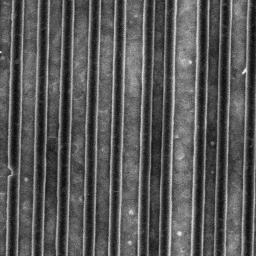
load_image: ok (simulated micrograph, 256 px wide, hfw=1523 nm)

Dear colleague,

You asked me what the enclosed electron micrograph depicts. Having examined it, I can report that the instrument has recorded parallel lines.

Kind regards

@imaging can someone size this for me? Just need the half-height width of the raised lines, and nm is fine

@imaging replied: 69.2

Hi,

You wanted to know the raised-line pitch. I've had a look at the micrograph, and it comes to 26.1 pixels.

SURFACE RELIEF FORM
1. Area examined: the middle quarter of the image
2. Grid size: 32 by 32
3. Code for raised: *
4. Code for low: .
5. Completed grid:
**....***...***.....**...***....
**....***...***.....**...***....
**....**....***.....**...***....
**....***...***.....**...***....
**....***...***.....**...***....
**....**....***.....**...***....
**....**....***.....**...***....
**....***...***.....**...***....
**....***...***.....**...***....
**....***...***....***...***....
**....**....***....***...***....
**....**....***....***...**.....
**....**....***....***...**.....
**....**....***....***...**.....
**...***....***....***...**.....
**...***....***....***...**.....
**...***....***....***...**.....
**...***....***....***...**.....
**....**....***....***...**.....
**....**....***....***...**.....
**....**....**.....***...**.....
*.....**....**.....***...**.....
*.....**....**.....***...**.....
*....***....**.....***...**.....
*....***....**.....***..***.....
*....***....**.....***..***.....
*....***....**.....***..***.....
*....***....**.....**...***.....
*....***....**.....**...***.....
*....***....**.....**...***.....
*....***....**.....**...***.....
*....***....**.....**...***.....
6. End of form